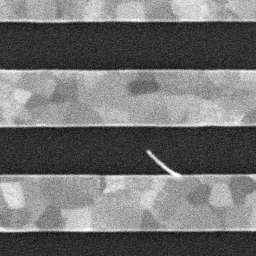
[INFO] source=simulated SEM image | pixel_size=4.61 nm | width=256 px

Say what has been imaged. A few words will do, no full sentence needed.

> wiring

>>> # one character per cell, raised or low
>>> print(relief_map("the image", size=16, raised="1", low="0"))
1111111111111111
0000000000000000
0000000000000000
0000000000000000
1111111111111111
1111111111111111
1111111111111111
1111111111111111
0000000000000000
0000000000000000
0000000000000000
1111111111111111
1111111111111111
1111111111111111
0000000000000000
0000000000000000